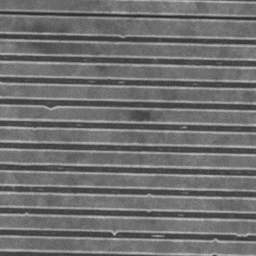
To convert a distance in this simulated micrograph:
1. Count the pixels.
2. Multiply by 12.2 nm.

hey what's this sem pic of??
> parallel lines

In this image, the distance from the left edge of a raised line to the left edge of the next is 266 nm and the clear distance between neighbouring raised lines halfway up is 88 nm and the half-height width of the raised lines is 178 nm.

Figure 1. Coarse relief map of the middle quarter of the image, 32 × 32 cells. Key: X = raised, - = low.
XXXXXXXXXXXXXXXXXXXXXXXXXXXXX---
XXXXXXXXXXXXXXXXXXXXXXXXXXXXXXXX
XXXXXXXXXXXXXXXXXXXXXXXXXXXXXXXX
-----------XXXXXXXXXXXXXXXXXXXXX
--------------------------------
XXXXXXXX------------------------
XXXXXXXXXXXXXXXXXXXXXXXXXXXXXXXX
XXXXXXXXXXXXXXXXXXXXXXXXXXXXXXXX
XXXXXXXXXXXXXXXXXXXXXXXXXXXXXXXX
--------------------------------
--------------------------------
XXXXXXXXXXXXXXXXXXXXXXXXXXXXXX--
XXXXXXXXXXXXXXXXXXXXXXXXXXXXXXXX
XXXXXXXXXXXXXXXXXXXXXXXXXXXXXXXX
------------XXXXXXXXXXXXXXXXXXXX
--------------------------------
XXXXXXXXXX----------------------
XXXXXXXXXXXXXXXXXXXXXXXXXXXXXXXX
XXXXXXXXXXXXXXXXXXXXXXXXXXXXXXXX
XXXXXXXXXXXXXXXXXXXXXXXXXXXXXXXX
--------------------------------
--------------------------------
XXXXXXXXXXXXXXXXXXXXXXXXXXXXXXX-
XXXXXXXXXXXXXXXXXXXXXXXXXXXXXXXX
XXXXXXXXXXXXXXXXXXXXXXXXXXXXXXXX
-------------XXXXXXXXXXXXXXXXXXX
--------------------------------
XXXXXXXXXXX--XXX----------------
XXXXXXXXXXXXXXXXXXXXXXXXXXXXXXXX
XXXXXXXXXXXXXXXXXXXXXXXXXXXXXXXX
XXXXXXXXXXXXXXXXXXXXXXXXXXXXXXXX
--------------------------------